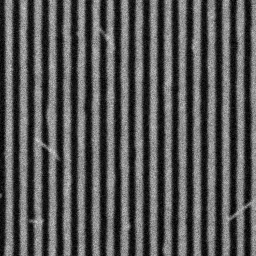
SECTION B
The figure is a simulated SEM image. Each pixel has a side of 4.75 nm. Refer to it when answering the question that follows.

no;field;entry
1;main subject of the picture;parallel lines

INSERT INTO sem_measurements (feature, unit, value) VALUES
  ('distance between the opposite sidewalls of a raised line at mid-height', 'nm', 29.1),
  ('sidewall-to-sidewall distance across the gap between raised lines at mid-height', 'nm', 37.4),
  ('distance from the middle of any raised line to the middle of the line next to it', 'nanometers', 68.7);